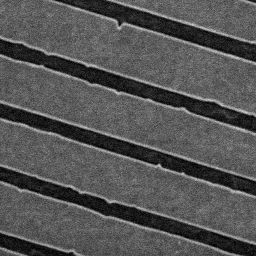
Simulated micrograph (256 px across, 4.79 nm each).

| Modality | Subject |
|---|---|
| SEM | one or a few lines or trenches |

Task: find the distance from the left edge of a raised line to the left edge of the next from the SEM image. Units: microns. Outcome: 0.299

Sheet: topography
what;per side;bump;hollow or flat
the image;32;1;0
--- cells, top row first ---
11111111000000011111111111111111
11111111111000000001111111111111
11111111111111000000001111111111
11111111111111111100000001111111
11111111111111111111100000001111
00011111111111111111111100000000
00000111111111111111111111100000
11000000011111111111111111111110
11111100000011111111111111111111
11111111100000001111111111111111
11111111111000000001111111111111
11111111111111100000001111111111
11111111111111111110000001111111
00111111111111111111110000000111
00000011111111111111111110000000
11100000011111111111111111110000
11111100000011111111111111111110
11111111100000001111111111111111
11111111111100000001111111111111
11111111111111100000001111111111
11111111111111111110000001111111
00011111111111111111110000000111
00000011111111111111111110000000
11000000011111111111111111110000
11111000000011111111111111111111
11111111100000011111111111111111
11111111111100000001111111111111
11111111111111100000001111111111
11111111111111111100000001111111
00111111111111111111110000000111
00000111111111111111111110000000
11000000011111111111111111110000